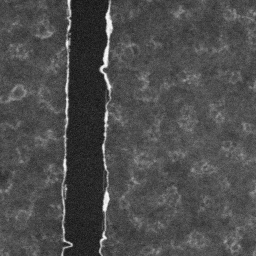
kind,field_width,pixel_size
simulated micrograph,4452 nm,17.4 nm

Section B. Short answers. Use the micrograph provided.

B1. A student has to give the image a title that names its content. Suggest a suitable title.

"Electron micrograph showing one or a few lines or trenches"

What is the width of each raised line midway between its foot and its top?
706 nm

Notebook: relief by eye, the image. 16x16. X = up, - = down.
----XXX---------
----XXX---------
----XXX---------
----XXX---------
----XXX---------
----XXX---------
----XXX---------
----XXX---------
----XXX---------
----XXX---------
----XXX---------
----XXX---------
----XXX---------
----XXX---------
----XXX---------
----XX----------